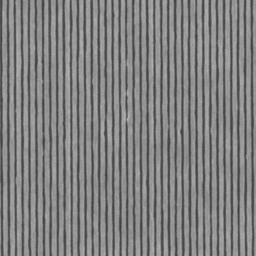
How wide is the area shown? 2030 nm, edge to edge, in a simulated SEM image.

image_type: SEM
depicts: parallel lines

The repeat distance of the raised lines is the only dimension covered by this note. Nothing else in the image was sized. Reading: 55.3 nm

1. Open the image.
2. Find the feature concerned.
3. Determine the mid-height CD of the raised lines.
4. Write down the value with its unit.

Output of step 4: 36.7 nm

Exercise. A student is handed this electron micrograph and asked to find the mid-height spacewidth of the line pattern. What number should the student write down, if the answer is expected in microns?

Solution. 0.0218